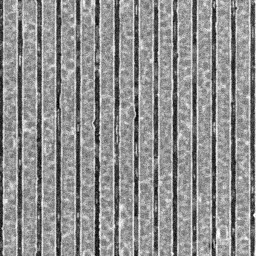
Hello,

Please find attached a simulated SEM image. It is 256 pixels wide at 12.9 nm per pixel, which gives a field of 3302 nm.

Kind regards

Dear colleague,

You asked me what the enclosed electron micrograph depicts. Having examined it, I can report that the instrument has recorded parallel lines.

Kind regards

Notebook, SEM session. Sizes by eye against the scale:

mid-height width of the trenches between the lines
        0.0661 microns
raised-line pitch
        250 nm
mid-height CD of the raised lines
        177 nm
